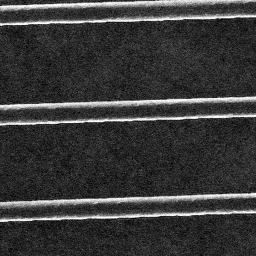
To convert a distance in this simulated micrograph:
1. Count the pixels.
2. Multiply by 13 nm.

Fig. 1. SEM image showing lines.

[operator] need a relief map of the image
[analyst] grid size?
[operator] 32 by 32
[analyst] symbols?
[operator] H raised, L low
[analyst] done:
LLLLLLLLLLLLLLLHHHHHHHHHHHHHHHHH
HHHHHHHHHHHHHHHHHHHHHHHHHHHHHHHH
HHHHHHHHHHHHHHHHHHHLLLLLLLLLLLLL
LLLLLLLLLLLLLLLLLLLLLLLLLLLLLLLL
LLLLLLLLLLLLLLLLLLLLLLLLLLLLLLLL
LLLLLLLLLLLLLLLLLLLLLLLLLLLLLLLL
LLLLLLLLLLLLLLLLLLLLLLLLLLLLLLLL
LLLLLLLLLLLLLLLLLLLLLLLLLLLLLLLL
LLLLLLLLLLLLLLLLLLLLLLLLLLLLLLLL
LLLLLLLLLLLLLLLLLLLLLLLLLLLLLLLL
LLLLLLLLLLLLLLLLLLLLLLLLLLLLLLLL
LLLLLLLLLLLLLLLLLLLLLLLLLLLLLLLL
LLLLLLLLLLLLLLLLLLLLLLLLLHHHHHHH
HHHHHHHHHHHHHHHHHHHHHHHHHHHHHHHH
HHHHHHHHHHHHHHHHHHHHHHHHHHHHHHHL
LLLLLLLLLLLLLLLLLLLLLLLLLLLLLLLL
LLLLLLLLLLLLLLLLLLLLLLLLLLLLLLLL
LLLLLLLLLLLLLLLLLLLLLLLLLLLLLLLL
LLLLLLLLLLLLLLLLLLLLLLLLLLLLLLLL
LLLLLLLLLLLLLLLLLLLLLLLLLLLLLLLL
LLLLLLLLLLLLLLLLLLLLLLLLLLLLLLLL
LLLLLLLLLLLLLLLLLLLLLLLLLLLLLLLL
LLLLLLLLLLLLLLLLLLLLLLLLLLLLLLLL
LLLLLLLLLLLLLLLLLLLLLLLLLLLLLLLL
LLLLLLLLLLLLLLLLLLLLLLLLLLHHHHHH
LHHHHHHHHHHHHHHHHHHHHHHHHHHHHHHH
HHHHHHHHHHHHHHHHHHHHHHHHHHHHHHHL
HHHLLLLLLLLLLLLLLLLLLLLLLLLLLLLL
LLLLLLLLLLLLLLLLLLLLLLLLLLLLLLLL
LLLLLLLLLLLLLLLLLLLLLLLLLLLLLLLL
LLLLLLLLLLLLLLLLLLLLLLLLLLLLLLLL
LLLLLLLLLLLLLLLLLLLLLLLLLLLLLLLL